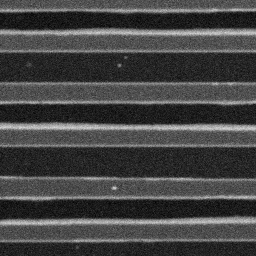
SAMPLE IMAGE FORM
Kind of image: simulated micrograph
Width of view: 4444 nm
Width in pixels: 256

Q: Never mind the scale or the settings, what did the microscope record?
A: lines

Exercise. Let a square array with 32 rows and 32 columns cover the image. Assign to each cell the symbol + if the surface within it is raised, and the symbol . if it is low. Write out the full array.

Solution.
++++++++++++++++++++++++++++++++
................................
................................
................................
++++++++++++++++++++++++++++++++
++++++++++++++++++++++++++++++++
................................
................................
................................
................................
++++++++++++++++++++++++++++++++
++++++++++++++++++++++++++++++++
++++++++++++++++++++++++++++++++
................................
................................
................................
++++++++++++++++++++++++++++++++
++++++++++++++++++++++++++++++++
................................
................................
................................
................................
++++++++++++++++++++++++++++++++
++++++++++++++++++++++++++++++++
++++++++++++++++++++++++++++++++
................................
................................
................................
++++++++++++++++++++++++++++++++
++++++++++++++++++++++++++++++++
................................
................................